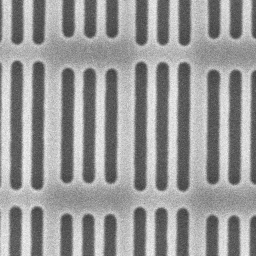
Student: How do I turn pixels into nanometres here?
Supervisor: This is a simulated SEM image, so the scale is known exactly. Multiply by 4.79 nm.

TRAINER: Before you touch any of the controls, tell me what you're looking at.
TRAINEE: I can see groups of lines, slits or small figures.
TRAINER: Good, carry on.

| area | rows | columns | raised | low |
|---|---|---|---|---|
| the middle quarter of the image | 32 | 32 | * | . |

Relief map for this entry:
******************...**...***...
..***...***..*****...**...**....
...**...**....****...**...**....
...**...**....****...**...**....
...**...**....****...**....*....
...**...**....****...**....*....
...**...**....****...**...**....
...**...**....****...**...**....
...**...**....****...**...**....
...**...**....****...**...**....
...**...**....****...**...**....
...**...**....****...**...**....
...**...**....***....**...**....
...**...**....***....**...**....
...**...**....***....**...**....
...**...**....***....**...**....
...**...**....****...**...**....
...**...**....****...**...**....
...**...**....****...**...**....
...**...**....***....**...**....
...**...**....***....**...**....
...**...**...****....**...**....
...**...**...****....**...**....
...**...**...****....**...**....
...**...**...****....**...**...*
...*....**...****....**...**...*
...*....**...****....**...**...*
...*....**...****....**...**...*
..***...**...****....**...**...*
..***..****..****....**...**...*
*****************....**...**...*
******************..****.****..*